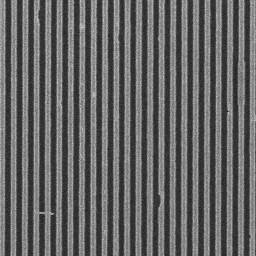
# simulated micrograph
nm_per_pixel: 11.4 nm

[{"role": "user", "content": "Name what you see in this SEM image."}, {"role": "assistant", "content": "parallel lines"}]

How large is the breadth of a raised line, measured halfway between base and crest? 4.75 pixels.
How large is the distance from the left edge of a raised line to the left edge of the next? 130 nanometres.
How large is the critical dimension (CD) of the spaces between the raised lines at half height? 0.0755 µm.